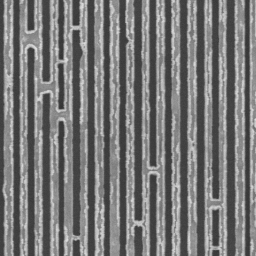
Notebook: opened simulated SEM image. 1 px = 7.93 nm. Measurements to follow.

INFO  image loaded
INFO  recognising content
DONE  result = parallel lines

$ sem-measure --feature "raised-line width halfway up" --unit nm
63.5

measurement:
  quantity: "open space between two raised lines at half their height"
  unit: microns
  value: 0.0565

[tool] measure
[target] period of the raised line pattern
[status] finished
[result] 122 nanometres